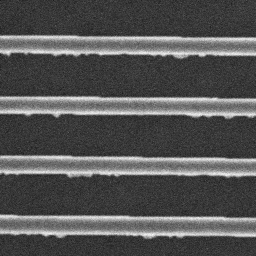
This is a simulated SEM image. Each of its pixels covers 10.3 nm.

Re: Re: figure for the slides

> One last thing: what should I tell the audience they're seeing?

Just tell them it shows lines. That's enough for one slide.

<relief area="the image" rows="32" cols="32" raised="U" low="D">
DDDDDDDDDDDDDDDDDDDDDDDDDDDDDDDD
DDDDDDDDDDDDDDDDDDDDDDDDDDDDDDDD
DDDDDDDDDDDDDDDDDDDDDDDDDDDDDDDD
DDDDDDDDDDDDDDDDDDDDDDDDDDDDDDDD
DDDDDDDDDDDDDDDDDDDDDDDDDDDDDDDD
UUUUUUUUUUUUUUUUUUUUUUUUUUUUUUUU
UUUUUUUUUUUUUUUUUUUUUUUUUUUUUUUU
DDDDDDDDDDDDDDDDDDDDDDDDDDDDDDDD
DDDDDDDDDDDDDDDDDDDDDDDDDDDDDDDD
DDDDDDDDDDDDDDDDDDDDDDDDDDDDDDDD
DDDDDDDDDDDDDDDDDDDDDDDDDDDDDDDD
DDDDDDDDDDDDDDDDDDDDDDDDDDDDDDDD
UUUUUUUUUUUUUUUUUUUUUUUUUUUUUUUU
UUUUUUUUUUUUUUUUUUUUUUUUUUUUUUUU
DDDDDDDDDDDDDDDDDDDDDDDDDDDDDDDD
DDDDDDDDDDDDDDDDDDDDDDDDDDDDDDDD
DDDDDDDDDDDDDDDDDDDDDDDDDDDDDDDD
DDDDDDDDDDDDDDDDDDDDDDDDDDDDDDDD
DDDDDDDDDDDDDDDDDDDDDDDDDDDDDDDD
DDDDDDDDDDDDDDDDDDDDDDDDDDDDDDDD
UUUUUUUUUUUUUUUUUUUUUUUUUUUUUUUU
UUUUUUUUUUUUUUUUUUUUUUUUUUUUUUUU
DDDDDDDDDDDDDDDDDDDDDDDDDDDDDDDD
DDDDDDDDDDDDDDDDDDDDDDDDDDDDDDDD
DDDDDDDDDDDDDDDDDDDDDDDDDDDDDDDD
DDDDDDDDDDDDDDDDDDDDDDDDDDDDDDDD
DDDDDDDDDDDDDDDDDDDDDDDDDDDDDDDD
UUUUUUUUUUUUUUUUUUUUUUUUUUUUUUUU
UUUUUUUUUUUUUUUUUUUUUUUUUUUUUUUU
DDDDDDDDDDDDDDDDDDDDDDDDDDDDDDDU
DDDDDDDDDDDDDDDDDDDDDDDDDDDDDDDD
DDDDDDDDDDDDDDDDDDDDDDDDDDDDDDDD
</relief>